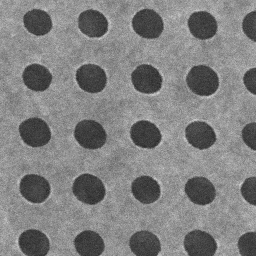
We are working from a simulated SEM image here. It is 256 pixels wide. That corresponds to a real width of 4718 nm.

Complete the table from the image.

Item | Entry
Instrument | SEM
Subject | a regular array of holes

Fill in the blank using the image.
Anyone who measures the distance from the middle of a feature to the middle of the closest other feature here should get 1.01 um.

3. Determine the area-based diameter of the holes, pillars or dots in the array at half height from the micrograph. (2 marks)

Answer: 561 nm